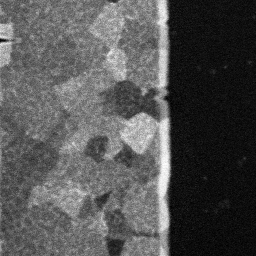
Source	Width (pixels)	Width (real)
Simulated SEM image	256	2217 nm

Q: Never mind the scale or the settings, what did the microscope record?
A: one or a few lines or trenches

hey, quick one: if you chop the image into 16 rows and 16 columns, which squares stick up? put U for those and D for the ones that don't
UUUUUUUUUUDDDDDD
UUUUUUUUUUDDDDDD
UUUUUUUUUUDDDDDD
UUUUUUUUUUDDDDDD
UUUUUUUUUUDDDDDD
UUUUUUUUUUDDDDDD
UUUUUUUUUUDDDDDD
UUUUUUUUUUDDDDDD
UUUUUUUUUUDDDDDD
UUUUUUUUUUDDDDDD
UUUUUUUUUUDDDDDD
UUUUUUUUUUDDDDDD
UUUUUUUUUUDDDDDD
UUUUUUUUUUDDDDDD
UUUUUUUUUUDDDDDD
UUUUUUUUUUDDDDDD